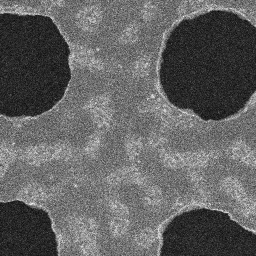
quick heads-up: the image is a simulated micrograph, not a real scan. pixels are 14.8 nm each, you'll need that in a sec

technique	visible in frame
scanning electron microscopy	holes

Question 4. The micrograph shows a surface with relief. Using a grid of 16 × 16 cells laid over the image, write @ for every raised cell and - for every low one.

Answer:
@@@@@@@@@@@@@@@@
---@@@@@@@@-----
----@@@@@@------
----@@@@@@------
----@@@@@@------
----@@@@@@------
---@@@@@@@@----@
@@@@@@@@@@@@@-@@
@@@@@@@@@@@@@@@@
@@@@@@@@@@@@@@@@
@@@@@@@@@@@@@@@@
@@@@@@@@@@@@@@@@
@@@@@@@@@@@@@@@@
---@@@@@@@@---@@
---@@@@@@@------
----@@@@@@------